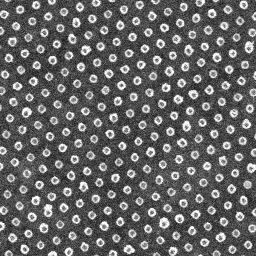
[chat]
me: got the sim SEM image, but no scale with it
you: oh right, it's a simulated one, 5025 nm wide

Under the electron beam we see a regular array of raised bodies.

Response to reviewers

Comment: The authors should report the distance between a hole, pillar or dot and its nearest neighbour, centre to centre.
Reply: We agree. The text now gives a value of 319 nm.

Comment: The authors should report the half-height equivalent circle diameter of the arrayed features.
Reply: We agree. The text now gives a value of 144 nm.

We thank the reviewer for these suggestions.